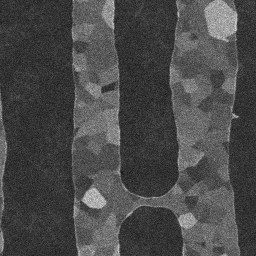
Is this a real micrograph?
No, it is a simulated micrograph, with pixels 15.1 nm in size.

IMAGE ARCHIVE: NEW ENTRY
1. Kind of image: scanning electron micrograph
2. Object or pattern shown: one or a few lines or trenches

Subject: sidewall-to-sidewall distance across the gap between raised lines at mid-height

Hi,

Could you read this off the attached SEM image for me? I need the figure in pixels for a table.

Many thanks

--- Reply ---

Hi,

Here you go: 61.1